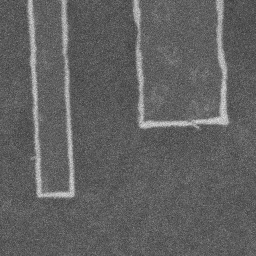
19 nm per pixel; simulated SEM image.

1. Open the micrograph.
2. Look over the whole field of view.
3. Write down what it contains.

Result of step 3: one or a few lines or trenches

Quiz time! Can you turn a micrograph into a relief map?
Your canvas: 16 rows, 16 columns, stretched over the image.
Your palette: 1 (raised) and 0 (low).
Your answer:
0011000001111100
0011000001111100
0011000001111100
0011000001111100
0011000001111100
0011000001111100
0011000001111100
0011000001111100
0011000000000000
0011000000000000
0011000000000000
0011000000000000
0000000000000000
0000000000000000
0000000000000000
0000000000000000